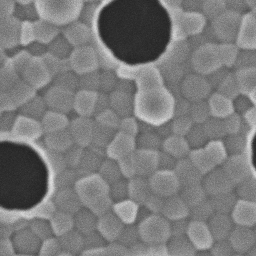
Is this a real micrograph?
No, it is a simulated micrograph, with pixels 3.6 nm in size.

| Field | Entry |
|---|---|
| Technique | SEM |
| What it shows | holes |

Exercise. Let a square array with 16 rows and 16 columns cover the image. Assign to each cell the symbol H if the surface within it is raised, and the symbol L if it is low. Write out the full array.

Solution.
HHHHHHLLLLHHHHHH
HHHHHHLLLLLHHHHH
HHHHHHLLLLLHHHHH
HHHHHHHLLLHHHHHH
HHHHHHHHHHHHHHHH
HHHHHHHHHHHHHHHH
HHHHHHHHHHHHHHHH
HHHHHHHHHHHHHHHH
HHHHHHHHHHHHHHHH
LLHHHHHHHHHHHHHH
LLLHHHHHHHHHHHHH
LLLHHHHHHHHHHHHH
LLLHHHHHHHHHHHHH
HHHHHHHHHHHHHHHH
HHHHHHHHHHHHHHHH
HHHHHHHHHHHHHHHH